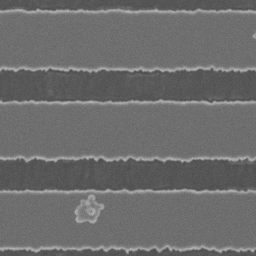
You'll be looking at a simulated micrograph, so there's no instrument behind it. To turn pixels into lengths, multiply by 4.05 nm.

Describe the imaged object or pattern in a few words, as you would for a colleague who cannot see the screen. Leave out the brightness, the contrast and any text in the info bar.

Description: lines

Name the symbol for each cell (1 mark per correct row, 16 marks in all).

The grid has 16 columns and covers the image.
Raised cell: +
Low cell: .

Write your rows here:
................
++++++++++++++++
++++++++++++++++
++++++++++++++++
................
................
++++++++++++++++
++++++++++++++++
++++++++++++++++
++++++++++++++++
................
................
++++++++++++++++
++++++++++++++++
++++++++++++++++
++++++++++++++++